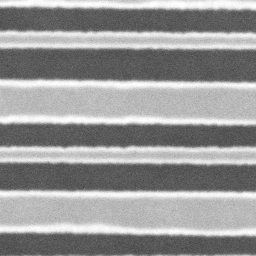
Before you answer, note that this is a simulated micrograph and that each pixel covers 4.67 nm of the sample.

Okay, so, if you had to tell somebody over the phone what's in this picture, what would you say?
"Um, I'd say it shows lines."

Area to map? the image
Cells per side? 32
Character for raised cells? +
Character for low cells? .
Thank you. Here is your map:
++++.+++++++++++++++++++++++++++
................................
................................
................................
++++++++++++++++++++++++++++++++
++++++++++++++++++++++++++++++++
................................
................................
................................
................................
+++++++++++++++.+++++++.+++++...
++++++++++++++++++++++++++++++++
++++++++++++++++++++++++++++++++
++++++++++++++++++++++++++++++++
++++++++++++++++++++++++++++++++
................................
................................
................................
++++++++.++++++.+++++++..++..+++
++++++++++++++++++++++++++++++++
................................
................................
................................
................................
++++++++++++++++++++++++++++++++
++++++++++++++++++++++++++++++++
++++++++++++++++++++++++++++++++
++++++++++++++++++++++++++++++++
++++++++++++++++++++++++++++++++
................................
................................
................................